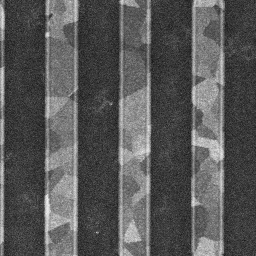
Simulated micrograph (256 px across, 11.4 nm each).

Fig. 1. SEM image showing one or a few lines or trenches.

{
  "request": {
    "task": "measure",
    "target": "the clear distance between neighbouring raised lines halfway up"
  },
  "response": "523 nanometers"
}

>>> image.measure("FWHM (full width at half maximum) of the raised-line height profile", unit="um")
0.314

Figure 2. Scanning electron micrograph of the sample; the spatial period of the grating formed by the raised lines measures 832 nanometers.